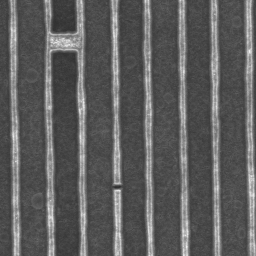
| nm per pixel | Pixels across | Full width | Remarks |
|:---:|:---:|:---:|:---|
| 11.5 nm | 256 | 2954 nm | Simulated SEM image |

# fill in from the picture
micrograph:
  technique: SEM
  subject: parallel lines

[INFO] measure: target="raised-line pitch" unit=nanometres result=388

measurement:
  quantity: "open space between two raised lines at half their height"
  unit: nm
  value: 317